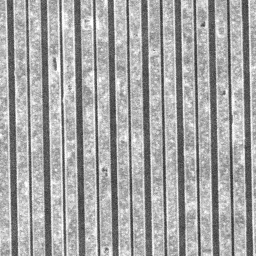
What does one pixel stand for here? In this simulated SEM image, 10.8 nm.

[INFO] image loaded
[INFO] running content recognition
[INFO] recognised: parallel lines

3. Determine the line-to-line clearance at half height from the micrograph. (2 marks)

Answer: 71.6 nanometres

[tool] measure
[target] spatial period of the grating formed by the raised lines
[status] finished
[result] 180 nm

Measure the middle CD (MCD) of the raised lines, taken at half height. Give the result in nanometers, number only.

126